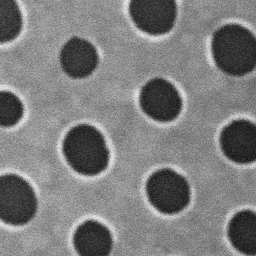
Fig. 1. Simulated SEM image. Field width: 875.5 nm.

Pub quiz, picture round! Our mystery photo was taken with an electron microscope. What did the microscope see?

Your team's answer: holes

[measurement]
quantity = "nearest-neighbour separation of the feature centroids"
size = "308 nm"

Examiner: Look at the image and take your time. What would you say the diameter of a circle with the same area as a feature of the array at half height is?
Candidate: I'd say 0.157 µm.